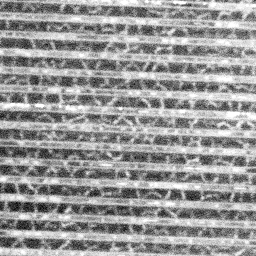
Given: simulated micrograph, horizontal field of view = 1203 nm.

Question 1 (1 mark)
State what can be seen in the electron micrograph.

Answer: parallel lines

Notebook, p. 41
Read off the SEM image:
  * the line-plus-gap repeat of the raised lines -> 85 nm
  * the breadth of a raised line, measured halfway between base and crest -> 59.9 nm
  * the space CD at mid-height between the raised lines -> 25.8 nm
